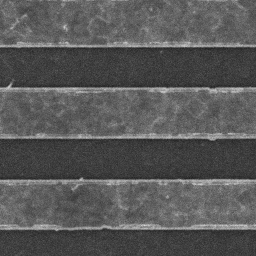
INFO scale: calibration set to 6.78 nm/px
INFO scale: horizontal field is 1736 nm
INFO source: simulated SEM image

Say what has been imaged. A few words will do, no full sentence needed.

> one or a few lines or trenches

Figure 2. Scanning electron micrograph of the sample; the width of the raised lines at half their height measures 330 nm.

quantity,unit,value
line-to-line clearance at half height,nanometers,288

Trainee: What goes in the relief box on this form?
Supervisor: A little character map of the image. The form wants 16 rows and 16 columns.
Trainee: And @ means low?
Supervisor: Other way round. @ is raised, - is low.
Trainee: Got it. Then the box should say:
@@@@@@@@@@@@@@@@
@@@@@@@@@@@@@@@@
@@@@@@@@@@@@@@@@
----------------
----------------
@---------------
@@@@@@@@@@@@@@@@
@@@@@@@@@@@@@@@@
@@@@@@@@@@@@@@@@
----------------
----------------
@@@@@@@@@@@@@@@@
@@@@@@@@@@@@@@@@
@@@@@@@@@@@@@@@@
----------------
----------------